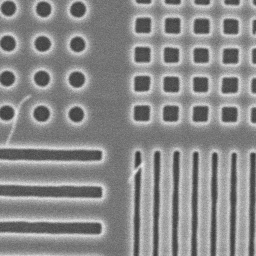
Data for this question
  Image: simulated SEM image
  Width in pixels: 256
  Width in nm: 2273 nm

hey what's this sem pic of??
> groups of lines, slits or small figures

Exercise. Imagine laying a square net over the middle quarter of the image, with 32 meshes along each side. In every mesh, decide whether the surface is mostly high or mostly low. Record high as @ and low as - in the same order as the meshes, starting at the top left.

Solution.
@@@@@@@@@@@@@@@@@@@@@@@@@@@@@@@@
@@@@@@@@@@@@@@@@@@@@@@@@@@@@@@@@
@@---@@@@@@@@@@@@@@@@@@@@@@@@@@@
@-----@@@@@@@@@@@-----@@@----@@@
@----@@@@@@@@@@@@-----@@@----@@@
@@---@@@@@@@@@@@@-----@@@----@@@
@@@@@@@@@@@@@@@@@----@@@@----@@@
@@@@@@@@@@@@@@@@@@@@@@@@@@@@@@@@
@@@@@@@@@@@@@@@@@@@@@@@@@@@@@@@@
@@@@@@@@@@@@@@@@@@@@@@@@@@@@@@@@
@@@@@@@@@@@@@@@@@@---@@@@---@@@@
@----@@@@@@@@@@@@-----@@-----@@@
@----@@@@@@@@@@@@-----@@-----@@@
@----@@@@@@@@@@@@-----@@-----@@@
@@--@@@@@@@@@@@@@@---@@@@---@@@@
@@@@@@@@@@@@@@@@@@@@@@@@@@@@@@@@
@@@@@@@@@@@@@@@@@@@@@@@@@@@@@@@@
@@@@@@@@@@@@@@@@@@@@@@@@@@@@@@@@
@@@@@@@@@@@@@@@@@@@@@@@@@@@@@@@@
@@@@@@@@@@@@@@@@@@@@@@@@@@@@@@@@
@@@@@@@@@@@@@@@@@@@@@@@@@@@@@@@@
---------@@@@@@@@@@@@@@@@@@@@@@@
----------@@@@@@@@-@@@--@@@--@@@
----------@@@@@@@@-@@@--@@@--@@@
@@@@@@@@@@@@@@@@@--@@@--@@@--@@@
@@@@@@@@@@@@@@@@@--@@@--@@@--@@@
@@@@@@@@@@@@@@@@@@-@@@--@@@--@@@
@@@@@@@@@@@@@@@@@@-@@@--@@@--@@@
@@@@@@@@@@@@@@@@@--@@@--@@@--@@@
@@@@@@@@@@@@@@@@@--@@@--@@@--@@@
---------@@@@@@@@--@@@--@@@--@@@
----------@@@@@@@--@@@--@@@--@@@